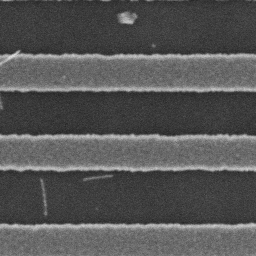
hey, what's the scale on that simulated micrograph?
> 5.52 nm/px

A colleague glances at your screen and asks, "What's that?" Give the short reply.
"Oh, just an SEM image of lines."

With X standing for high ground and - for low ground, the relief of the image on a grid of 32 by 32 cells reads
--------------------------------
--------------------------------
--------------------------------
--------------------------------
--------------------------------
--------------------------------
--------------------------------
XXXXXXXXXXXXXXXXXXXXXXXXXXXXXXXX
XXXXXXXXXXXXXXXXXXXXXXXXXXXXXXXX
XXXXXXXXXXXXXXXXXXXXXXXXXXXXXXXX
XXXXXXXXXXXXXXXXXXXXXXXXXXXXXXXX
--------------------------------
--------------------------------
--------------------------------
--------------------------------
--------------------------------
--------------------------------
XXXXXXXXXXXXXXXXXXXXXXXXXXXXXXXX
XXXXXXXXXXXXXXXXXXXXXXXXXXXXXXXX
XXXXXXXXXXXXXXXXXXXXXXXXXXXXXXXX
XXXXXXXXXXXXXXXXXXXXXXXXXXXXXXXX
--------------------------------
--------------------------------
--------------------------------
--------------------------------
--------------------------------
--------------------------------
--------------------------------
XXXXXXXXXXXXXXXXXXXXXXXXXXXXXXXX
XXXXXXXXXXXXXXXXXXXXXXXXXXXXXXXX
XXXXXXXXXXXXXXXXXXXXXXXXXXXXXXXX
XXXXXXXXXXXXXXXXXXXXXXXXXXXXXXXX